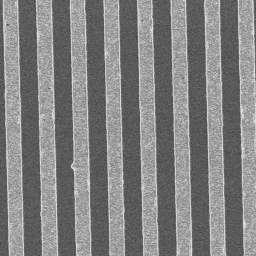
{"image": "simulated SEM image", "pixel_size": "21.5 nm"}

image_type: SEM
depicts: parallel lines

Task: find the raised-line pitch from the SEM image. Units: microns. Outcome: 0.723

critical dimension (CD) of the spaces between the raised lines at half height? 411 nm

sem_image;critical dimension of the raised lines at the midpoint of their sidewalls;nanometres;301